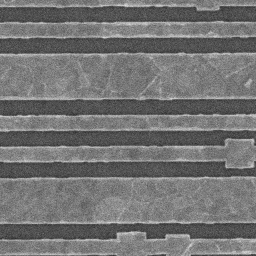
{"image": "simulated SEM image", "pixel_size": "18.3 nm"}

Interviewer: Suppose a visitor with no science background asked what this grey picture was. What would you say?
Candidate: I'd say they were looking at wiring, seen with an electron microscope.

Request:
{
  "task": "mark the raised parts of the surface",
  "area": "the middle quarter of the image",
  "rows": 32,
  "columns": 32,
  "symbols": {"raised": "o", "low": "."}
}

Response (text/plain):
oooooooooooooooooooooooooooooooo
oooooooooooooooooooooooooooooooo
oooooooooooooooooooooooooooooooo
oooooooooooooooooooooooooooooooo
oooooooooooooooooooooooooooooooo
oooooooooooooooooooooooooooooooo
oooooooooooooooooooooooooooooooo
oooooooooooooooooooooooooooooooo
oooooooooooooooooooooooooooooooo
................................
................................
................................
................................
oooooooooooooooooooooooooooooooo
oooooooooooooooooooooooooooooooo
oooooooooooooooooooooooooooooooo
................................
................................
................................
................................
................................
oooooooooooooooooooooooooooooooo
oooooooooooooooooooooooooooooooo
oooooooooooooooooooooooooooooooo
................................
................................
................................
................................
................................
oooooooooooooooooooooooooooooooo
oooooooooooooooooooooooooooooooo
oooooooooooooooooooooooooooooooo